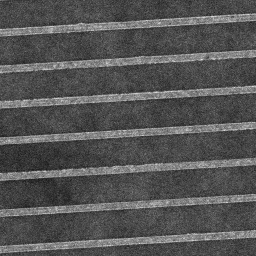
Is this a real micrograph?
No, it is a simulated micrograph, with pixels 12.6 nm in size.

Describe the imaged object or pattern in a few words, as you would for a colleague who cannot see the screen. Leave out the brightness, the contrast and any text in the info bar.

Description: parallel lines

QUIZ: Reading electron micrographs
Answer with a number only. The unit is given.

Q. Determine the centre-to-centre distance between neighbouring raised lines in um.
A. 0.453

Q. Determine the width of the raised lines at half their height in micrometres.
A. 0.0847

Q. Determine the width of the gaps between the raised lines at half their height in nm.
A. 372